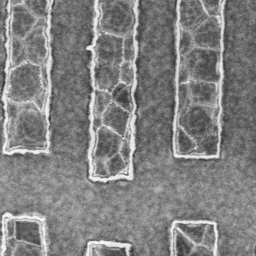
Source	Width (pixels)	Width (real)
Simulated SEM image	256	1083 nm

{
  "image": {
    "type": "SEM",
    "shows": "one or a few lines or trenches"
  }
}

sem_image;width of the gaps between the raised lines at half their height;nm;183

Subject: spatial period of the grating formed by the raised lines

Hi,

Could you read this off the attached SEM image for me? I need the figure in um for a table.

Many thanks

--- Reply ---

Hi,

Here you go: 0.362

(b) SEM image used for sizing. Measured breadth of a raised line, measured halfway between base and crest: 180 nm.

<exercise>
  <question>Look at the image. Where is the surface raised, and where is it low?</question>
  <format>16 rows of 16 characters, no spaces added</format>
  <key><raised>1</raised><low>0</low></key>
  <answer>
0110001110011100
0110001110011100
1110001100011100
0110001100011100
1110001100011100
1110001100011100
1110001100011100
1110001100011100
1110001100011100
0000001100011100
0000001100000000
0000000000000000
0000000000000000
0000000000000000
1110000000011000
1110001100011000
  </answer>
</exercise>